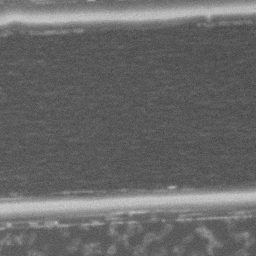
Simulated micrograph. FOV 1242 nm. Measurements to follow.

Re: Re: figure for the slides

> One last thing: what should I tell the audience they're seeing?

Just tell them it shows one or a few lines or trenches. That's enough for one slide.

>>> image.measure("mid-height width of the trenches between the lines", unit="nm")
907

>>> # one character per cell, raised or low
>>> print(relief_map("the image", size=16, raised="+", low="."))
++++++++++++++++
................
................
................
................
................
................
................
................
................
................
................
...........+++++
++++++++++++++++
++++++++++++++++
++++++++++++++++